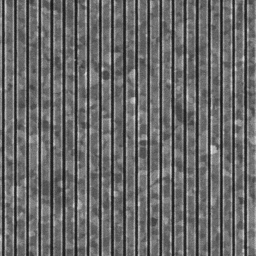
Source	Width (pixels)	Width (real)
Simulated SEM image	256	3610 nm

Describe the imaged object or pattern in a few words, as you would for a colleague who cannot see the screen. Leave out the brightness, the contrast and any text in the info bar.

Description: parallel lines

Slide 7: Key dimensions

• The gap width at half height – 49.4 nm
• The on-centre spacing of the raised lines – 12.1 px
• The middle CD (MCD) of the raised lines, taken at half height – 113 nm